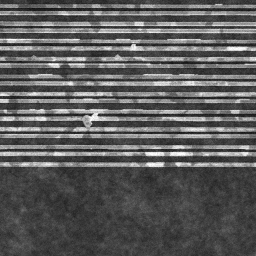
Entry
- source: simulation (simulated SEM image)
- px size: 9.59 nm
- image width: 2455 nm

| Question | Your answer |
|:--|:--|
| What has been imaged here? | parallel lines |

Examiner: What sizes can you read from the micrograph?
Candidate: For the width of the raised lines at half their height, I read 3.38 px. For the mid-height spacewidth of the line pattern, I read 0.0623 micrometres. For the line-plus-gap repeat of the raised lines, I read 84.4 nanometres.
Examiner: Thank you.